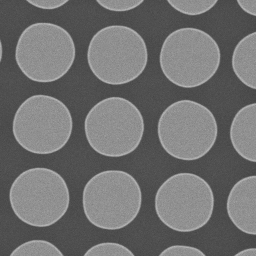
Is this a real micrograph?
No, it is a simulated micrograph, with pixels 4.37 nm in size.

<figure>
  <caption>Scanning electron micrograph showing an array of small figures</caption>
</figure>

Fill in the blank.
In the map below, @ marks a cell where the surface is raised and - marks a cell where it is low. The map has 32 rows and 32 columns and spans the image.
----@@@@-----@@@@----@@@@@@---@@
-----------------------@@@-----@
--------------------------------
---@@@@@-----@@@-------@--------
---@@@@@@---@@@@@@---@@@@@-----@
--@@@@@@@--@@@@@@@--@@@@@@@---@@
--@@@@@@@--@@@@@@@--@@@@@@@--@@@
--@@@@@@@--@@@@@@@--@@@@@@@--@@@
---@@@@@@--@@@@@@@--@@@@@@@--@@@
---@@@@@----@@@@@----@@@@@@---@@
--------------@-------@@@------@
--------------------------------
---@@@@------@@@----------------
--@@@@@@----@@@@@----@@@@@----@@
--@@@@@@@--@@@@@@@--@@@@@@@--@@@
--@@@@@@@--@@@@@@@--@@@@@@@--@@@
--@@@@@@@--@@@@@@@--@@@@@@@--@@@
--@@@@@@---@@@@@@@--@@@@@@@--@@@
---@@@@@----@@@@@---@@@@@@---@@@
--------------@-------@@@-----@@
--------------------------------
---@@@@------@@-----------------
--@@@@@@---@@@@@@----@@@@-----@@
-@@@@@@@---@@@@@@---@@@@@@---@@@
-@@@@@@@@-@@@@@@@@-@@@@@@@@--@@@
-@@@@@@@@-@@@@@@@@-@@@@@@@@-@@@@
--@@@@@@---@@@@@@---@@@@@@--@@@@
---@@@@----@@@@@@---@@@@@@---@@@
-------------@@------@@@@-----@@
--------------------------------
---@@@-------@@-----------------
--@@@@@@---@@@@@----@@@@@-----@@